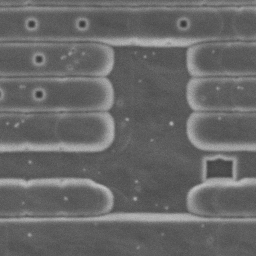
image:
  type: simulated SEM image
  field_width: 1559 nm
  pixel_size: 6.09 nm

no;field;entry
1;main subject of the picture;wiring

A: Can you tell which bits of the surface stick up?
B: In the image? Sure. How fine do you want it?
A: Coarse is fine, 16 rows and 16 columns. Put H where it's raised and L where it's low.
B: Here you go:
HHHHHHHHHHHHHHHH
HHHHHHHHHHHHHHHH
HHHHHHHHHHHHHHHH
HHHHHHHLLLLLHHHH
HHHHHHLLLLLLHHHH
HHHHHHHLLLLLHHHH
HHHHHHHLLLLLHHHH
HHHHHHHLLLLLHHHH
HHHHHHHLLLLLHHHH
LLLLLLLLLLLLLLLL
LLLLLLLLLLLLLLLL
HHHHHHLLLLLLLLLH
HHHHHHHLLLLLHHHH
HHHHHHHLLLLLHHHH
HHHHHHHHHHHHHHHH
HHHHHHHHHHHHHHHH